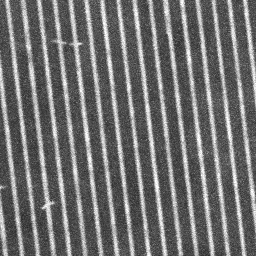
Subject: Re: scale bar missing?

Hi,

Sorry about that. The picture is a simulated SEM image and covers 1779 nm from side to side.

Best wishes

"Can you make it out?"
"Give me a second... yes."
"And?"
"parallel lines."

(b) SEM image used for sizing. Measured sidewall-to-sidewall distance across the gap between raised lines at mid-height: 90.5 nm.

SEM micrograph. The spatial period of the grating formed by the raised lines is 109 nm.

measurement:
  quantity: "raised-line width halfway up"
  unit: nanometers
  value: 21.5